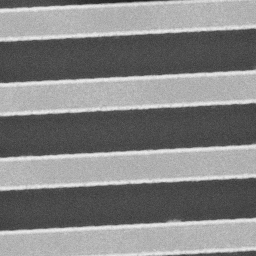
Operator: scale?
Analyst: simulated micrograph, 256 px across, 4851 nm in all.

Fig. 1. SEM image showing lines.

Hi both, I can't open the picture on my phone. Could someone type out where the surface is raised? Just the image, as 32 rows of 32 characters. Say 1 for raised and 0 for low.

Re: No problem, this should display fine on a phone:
00000000000011111111111111111111
11111111111111111111111111111111
11111111111111111111111111111111
11111111111111111111111111111111
11111111111110000000000000000000
00000000000000000000000000000000
00000000000000000000000000000000
00000000000000000000000000000000
00000000000000000000000000000000
00000000000000000011111111111111
11111111111111111111111111111111
11111111111111111111111111111111
11111111111111111111111111111111
11111111111111111110000000000000
00000000000000000000000000000000
00000000000000000000000000000000
00000000000000000000000000000000
00000000000000000000000000000000
00000000000000000000000011111111
00000111111111111111111111111111
11111111111111111111111111111111
11111111111111111111111111111111
11111111111111111111111100000000
11111000000000000000000000000000
00000000000000000000000000000000
00000000000000000000000000000000
00000000000000000000000000000000
00000000000000000000000000011111
00000000111111111111111111111111
11111111111111111111111111111111
11111111111111111111111111111111
11111111111111111111111111100000